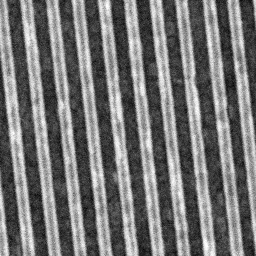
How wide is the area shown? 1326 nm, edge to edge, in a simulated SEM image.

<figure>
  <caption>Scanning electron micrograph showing parallel lines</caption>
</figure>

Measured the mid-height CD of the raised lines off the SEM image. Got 44.3 nanometers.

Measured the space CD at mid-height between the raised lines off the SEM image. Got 17.1 pixels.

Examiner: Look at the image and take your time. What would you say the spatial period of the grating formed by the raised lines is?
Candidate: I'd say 134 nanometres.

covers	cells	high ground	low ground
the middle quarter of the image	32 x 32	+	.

....++.....++....++.....++....++
....++.....++....++.....++....++
....+++....++.....++....++....++
....+++....++.....++....++....++
.....++....++.....++....++....++
.....++....++.....++....++.....+
+....++.....+.....++....++.....+
+....++.....++....++.....++....+
+....++.....++....++.....++....+
+....++.....++....++.....++....+
+....++.....++....++.....++....+
+....+++....++.....++....++....+
+.....++....++.....++....++.....
+.....++....++.....++....++.....
+.....++....++.....++....++.....
++....++.....++....++....++.....
++....++.....++....++.....++....
++....++.....++....++.....++....
++....++.....++....++.....++....
++....++.....++....++.....++....
++....+++....++.....++....++....
++.....++....++.....++....++....
++.....++....++.....++....++....
++.....++....++.....++....++....
+++....++.....++....++....++....
.++....++.....++....++.....++...
.++....++.....++....++.....++...
.++....++.....++....++.....++...
.++....+++....++....++.....++...
.++....+++....++.....++....++...
.++.....++....++.....++....++...
.++.....++....++.....++....++...